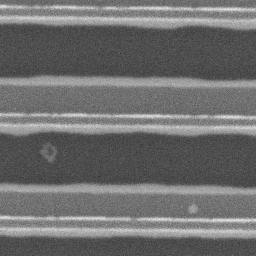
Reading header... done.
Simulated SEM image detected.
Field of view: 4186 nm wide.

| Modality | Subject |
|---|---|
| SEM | lines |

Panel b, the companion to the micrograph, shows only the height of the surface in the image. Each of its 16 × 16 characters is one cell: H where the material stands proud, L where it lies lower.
HHHHHHHHHHHHHHHH
LLLLLLLLLLLLLLLL
LLLLLLLLLLLLLLLL
LLLLLLLLLLLLLLLL
LLLLLLLLLLLLLLLL
HHHHHHHHHHHHHHHH
HHHHHHHHHHHHHHHH
HHHHHHHHHHHHHHHH
LLLLLLLLLLLLLLLL
LLLLLLLLLLLLLLLL
LLLLLLLLLLLLLLLL
LLLLLLLLLLLLLLLL
HHHHHHHHHHHHHHHH
HHHHHHHHHHHHHHHH
LLLLLHHLHHHHHHHH
LLLLLLLLLLLLLLLL